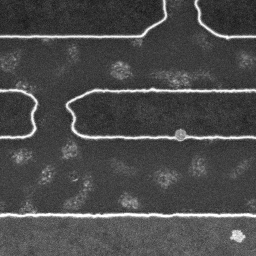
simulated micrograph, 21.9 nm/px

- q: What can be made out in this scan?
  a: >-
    one or a few lines or trenches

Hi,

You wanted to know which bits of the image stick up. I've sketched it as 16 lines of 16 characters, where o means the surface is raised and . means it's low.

oooooooooo..oooo
oooooooooo...ooo
................
................
................
................
oo..oooooooooooo
oo...ooooooooooo
oo...ooooooooooo
................
................
................
................
oooooooooooooooo
oooooooooooooooo
oooooooooooooooo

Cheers